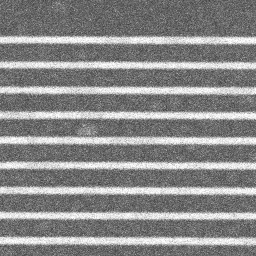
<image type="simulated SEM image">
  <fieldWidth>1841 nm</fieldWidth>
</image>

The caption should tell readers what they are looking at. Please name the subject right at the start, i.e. parallel lines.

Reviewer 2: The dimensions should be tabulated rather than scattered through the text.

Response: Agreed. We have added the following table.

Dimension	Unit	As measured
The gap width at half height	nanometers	144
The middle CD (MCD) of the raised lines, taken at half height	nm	39.6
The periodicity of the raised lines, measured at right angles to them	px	25.1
